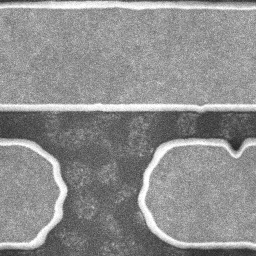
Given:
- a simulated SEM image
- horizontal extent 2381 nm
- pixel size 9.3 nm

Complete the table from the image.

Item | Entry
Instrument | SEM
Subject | one or a few lines or trenches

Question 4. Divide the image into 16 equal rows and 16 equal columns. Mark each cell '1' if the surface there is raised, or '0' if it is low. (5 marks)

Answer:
1111111111111111
1111111111111111
1111111111111111
1111111111111111
1111111111111111
1111111111111111
1111111111111111
0000000000000000
0000000000000000
1110000000111111
1111000001111111
1111000001111111
1111000001111111
1111000001111111
1110000000111111
0000000000000000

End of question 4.